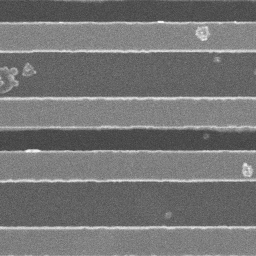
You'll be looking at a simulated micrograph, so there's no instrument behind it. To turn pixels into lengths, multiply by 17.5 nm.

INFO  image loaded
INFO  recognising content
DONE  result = lines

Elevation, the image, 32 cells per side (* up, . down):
................................
................................
................................
********************************
********************************
********************************
................................
................................
................................
................................
................................
................................
********************************
********************************
********************************
********************************
................................
................................
................................
********************************
********************************
********************************
***********.******.******...**..
................................
................................
................................
................................
................................
*.*....*..*.****.***************
********************************
********************************
********************************